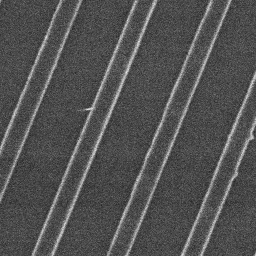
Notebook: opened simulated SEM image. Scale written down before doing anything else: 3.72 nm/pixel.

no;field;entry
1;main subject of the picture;one or a few lines or trenches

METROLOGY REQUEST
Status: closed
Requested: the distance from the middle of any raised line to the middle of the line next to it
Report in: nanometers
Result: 258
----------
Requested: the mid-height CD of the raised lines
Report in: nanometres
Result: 71.1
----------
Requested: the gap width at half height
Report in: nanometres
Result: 190